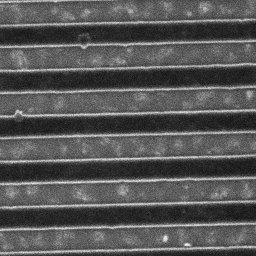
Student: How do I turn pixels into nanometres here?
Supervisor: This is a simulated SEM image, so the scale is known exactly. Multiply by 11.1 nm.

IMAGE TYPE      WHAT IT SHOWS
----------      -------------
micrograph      parallel lines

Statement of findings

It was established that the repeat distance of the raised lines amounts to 506 nm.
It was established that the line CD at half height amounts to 251 nm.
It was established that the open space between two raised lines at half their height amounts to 251 nanometres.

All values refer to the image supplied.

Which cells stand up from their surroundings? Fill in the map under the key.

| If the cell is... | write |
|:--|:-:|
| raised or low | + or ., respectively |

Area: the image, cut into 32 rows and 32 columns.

................................
................................
.............................+++
++++++++++++++++++++++++++++++++
++++++++++++++++++++++++++++++++
++++++++++++++++++..............
................................
................................
...............+++++++++++++++++
++++++++++++++++++++++++++++++++
++++++++++++++++++++++++++++++++
+++++++++.......................
................................
................................
.+++++++++++++++++++++++++++++++
++++++++++++++++++++++++++++++++
+++++++++++++++++++++++++++++++.
................................
................................
.............................+++
++++++++++++++++++++++++++++++++
++++++++++++++++++++++++++++++++
++++++++++++++++++++++..........
................................
................................
...................+++++++++++++
++++++++++++++++++++++++++++++++
++++++++++++++++++++++++++++++++
+++++++++.......................
................................
................................
.....+++++++++++++++++++++++++++